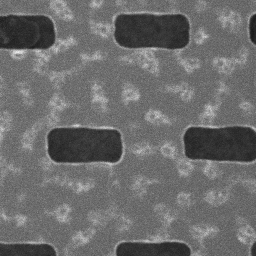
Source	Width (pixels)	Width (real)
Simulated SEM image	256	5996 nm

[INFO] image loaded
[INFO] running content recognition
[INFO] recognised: holes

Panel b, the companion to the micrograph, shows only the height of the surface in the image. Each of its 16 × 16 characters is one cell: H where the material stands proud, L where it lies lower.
HHHHHHHHHHHHHHHH
LLLHHHHLLLLLHHHH
LLLHHHHLLLLLHHHH
HHHHHHHHHHHHHHHH
HHHHHHHHHHHHHHHH
HHHHHHHHHHHHHHHH
HHHHHHHHHHHHHHHH
HHHHHHHHHHHHHHHH
HHHLLLLHHHHHLLLL
HHHLLLLLHHHHLLLL
HHHHHHHHHHHHHHHH
HHHHHHHHHHHHHHHH
HHHHHHHHHHHHHHHH
HHHHHHHHHHHHHHHH
HHHHHHHHHHHHHHHH
LLLHHHHLLLLLHHHH